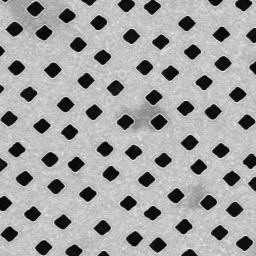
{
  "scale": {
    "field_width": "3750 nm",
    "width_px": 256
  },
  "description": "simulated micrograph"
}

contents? a regular array of holes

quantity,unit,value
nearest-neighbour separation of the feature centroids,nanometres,406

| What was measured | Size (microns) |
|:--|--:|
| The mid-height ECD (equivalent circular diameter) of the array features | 0.214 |